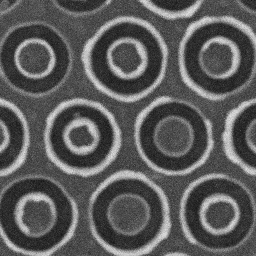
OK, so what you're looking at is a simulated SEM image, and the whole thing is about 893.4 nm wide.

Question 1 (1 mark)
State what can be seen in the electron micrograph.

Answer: ring-shaped grooves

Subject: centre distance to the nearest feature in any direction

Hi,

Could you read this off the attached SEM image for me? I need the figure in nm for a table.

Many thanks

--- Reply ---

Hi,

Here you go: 314